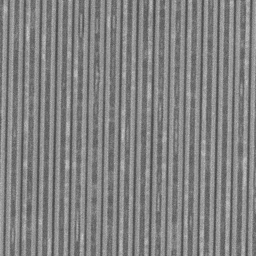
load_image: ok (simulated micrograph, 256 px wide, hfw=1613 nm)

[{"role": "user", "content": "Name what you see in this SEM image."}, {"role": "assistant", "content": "parallel lines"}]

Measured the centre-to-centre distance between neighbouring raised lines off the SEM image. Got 50.7 nanometres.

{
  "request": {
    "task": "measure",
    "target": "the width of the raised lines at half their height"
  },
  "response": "22 nanometers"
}